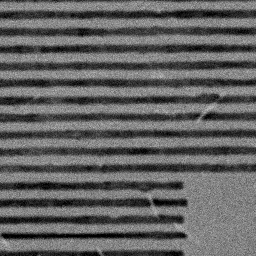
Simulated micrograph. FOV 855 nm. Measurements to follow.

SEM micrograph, parallel lines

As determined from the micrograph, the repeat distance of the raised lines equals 0.0569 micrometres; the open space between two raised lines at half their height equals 25.5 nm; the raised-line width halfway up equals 31.3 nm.